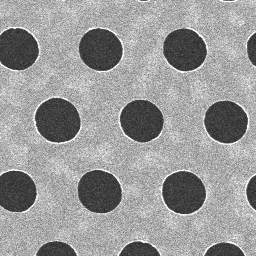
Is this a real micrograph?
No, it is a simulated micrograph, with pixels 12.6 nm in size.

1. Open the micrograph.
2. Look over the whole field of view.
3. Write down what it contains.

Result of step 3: holes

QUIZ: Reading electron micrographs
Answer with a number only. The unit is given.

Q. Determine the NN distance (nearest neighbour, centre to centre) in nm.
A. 1040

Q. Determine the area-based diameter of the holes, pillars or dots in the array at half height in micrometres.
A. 0.546